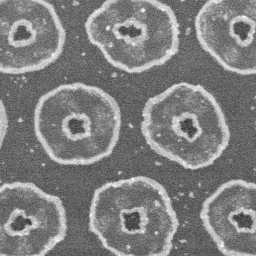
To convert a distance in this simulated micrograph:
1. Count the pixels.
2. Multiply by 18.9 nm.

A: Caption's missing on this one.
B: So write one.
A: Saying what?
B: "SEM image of ring-shaped raised bodies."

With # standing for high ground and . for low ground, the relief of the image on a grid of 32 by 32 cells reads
######.......#######......######
#######.....#########....#######
#######....###########...#####.#
##..###....####...####...####...
#...####...####...####...####..#
#######.....##########...#######
#######......########.....######
######........######.......#####
####............##...........###
................................
................................
.......#####.........####.......
.....#########......#######.....
.....#########.....########.....
.....####.#####...##########....
.....###...####...####...###....
.....###...###....####...###....
.....#########.....#########....
......########......########....
.......######........######.....
.......................###......
................................
.................#..............
####.........#######........####
######......########.......#####
#######.....#########.....######
########....####..###.....####.#
#...####...####...####....###...
#..#####....####..####....####..
########.....########......#####
######.......########.......####
#####..........######.......####